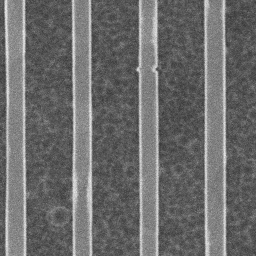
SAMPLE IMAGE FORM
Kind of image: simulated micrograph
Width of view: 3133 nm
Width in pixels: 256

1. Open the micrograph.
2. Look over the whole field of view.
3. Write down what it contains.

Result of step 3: one or a few lines or trenches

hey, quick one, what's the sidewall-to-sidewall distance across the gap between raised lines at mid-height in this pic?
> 600 nanometers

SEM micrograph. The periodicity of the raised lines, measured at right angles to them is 814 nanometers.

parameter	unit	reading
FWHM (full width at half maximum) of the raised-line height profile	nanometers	211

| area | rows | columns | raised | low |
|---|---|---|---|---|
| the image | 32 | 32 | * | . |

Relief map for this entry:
.**......**.......**......**....
.**......**.......**......**....
.**......**.......**......**....
.**......**.......**......**....
.**......**.......**......**....
.**......**.......**......**....
.**......**.......**......**....
.**......**.......**......**....
.**......**......**.......**....
.**......**......***......**....
.**......**.......**......**....
.**......**.......**......**....
.**......**.......**......**....
.**......**.......**......**....
.**......**.......**......**....
.**......**.......**......**....
.**......**.......**......**....
.**......**.......**......**....
.**......**.......**......**....
.**......**.......**......**....
.**......**.......**......**....
.**......**.......**......**....
.**......**.......**......**....
.**......**.......**......**....
.**......**.......**......**....
.**......**.......**......**....
.**......**.......**......**....
.**......**.......**......**....
.**......**.......**......**....
.**......**.......**......**....
.**......**.......**......**....
.**......**.......**......**....